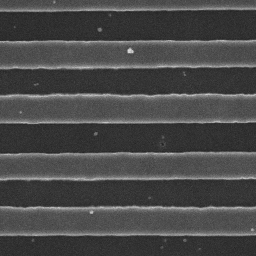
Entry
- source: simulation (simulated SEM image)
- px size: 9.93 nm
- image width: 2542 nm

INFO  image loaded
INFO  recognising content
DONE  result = lines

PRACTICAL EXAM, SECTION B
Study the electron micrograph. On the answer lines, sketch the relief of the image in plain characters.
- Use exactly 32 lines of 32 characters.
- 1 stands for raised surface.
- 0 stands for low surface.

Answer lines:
11111111111111111111111111111111
00000000000000000000000000000000
00000000000000000000000000000000
00000000000000000000000000000000
00000000000000000000000000000000
11111111111111111111111111111111
11111111111111111111111111111111
11111111111111111111111111111111
00000000000000000000000000000000
00000000000000000000000000000000
00000000000000000000000000000000
00000000000000000000000000000000
11111111111111111111111111111111
11111111111111111111111111111111
11111111111111111111111111111111
00000000000000000000000000000000
00000000000000000000000000000000
00000000000000000000000000000000
00000000000000000000000000000000
11111111111111111111111111111111
11111111111111111111111111111111
11111111111111111111111111111111
00000000000000000000000000000000
00000000000000000000000000000000
00000000000000000000000000000000
00000000000000000000000000000000
11111111111111111111111111111111
11111111111111111111111111111111
11111111111111111111111111111111
00000000000000000000000000000000
00000000000000000000000000000000
00000000000000000000000000000000